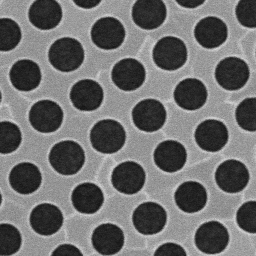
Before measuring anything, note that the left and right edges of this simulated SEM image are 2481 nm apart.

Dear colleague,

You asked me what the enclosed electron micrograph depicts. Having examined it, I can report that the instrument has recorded a regular array of holes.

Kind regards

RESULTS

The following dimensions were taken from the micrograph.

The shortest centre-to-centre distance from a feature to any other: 444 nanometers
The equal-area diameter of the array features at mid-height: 336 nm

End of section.